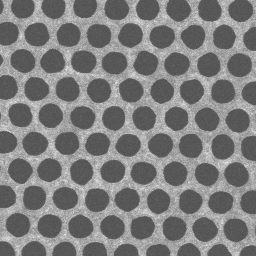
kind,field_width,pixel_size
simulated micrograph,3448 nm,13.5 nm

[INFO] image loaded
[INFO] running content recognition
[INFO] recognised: a regular array of holes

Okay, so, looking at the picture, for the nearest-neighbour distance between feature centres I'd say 30.5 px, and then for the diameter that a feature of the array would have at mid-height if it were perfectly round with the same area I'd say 0.323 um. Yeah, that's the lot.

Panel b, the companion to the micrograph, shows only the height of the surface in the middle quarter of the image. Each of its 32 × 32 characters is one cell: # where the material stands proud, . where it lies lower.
##......##......#......##......#
###....###.....###.....##......#
###########...#####...####...###
..##############################
...###.....####....####...####..
....##......##.....###.....##...
....##......##......##......#...
....##......##......##.....##...
...####....###.....###.....###..
#######...######..#####...#####.
####.#######.###################
##.....###.....###....####....##
##.....###.....##......##......#
##......#......##......##......#
##......##.....##......##......#
###....###.....###.....###....##
############.######..######..###
...####...#####..######..######.
...###.....###....####.....##...
....#......##......##......##...
....#......##......##......##...
...###.....##......##......##...
..#####...####....####....###...
###############################.
###...#####...#####.#######.####
##.....###.....##.....###.....##
##.....##......##......##......#
##.....##......##......##......#
##.....###.....##......##.....##
###...#####..#####....####....##
###########################.####
...###....####...######..######.